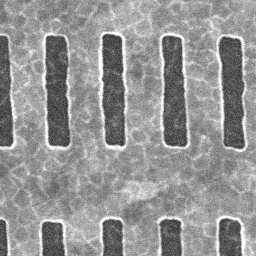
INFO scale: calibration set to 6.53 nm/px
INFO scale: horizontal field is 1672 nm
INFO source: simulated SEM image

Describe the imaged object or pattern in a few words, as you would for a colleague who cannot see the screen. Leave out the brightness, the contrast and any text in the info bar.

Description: holes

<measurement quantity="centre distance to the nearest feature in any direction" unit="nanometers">374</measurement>